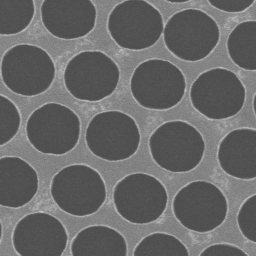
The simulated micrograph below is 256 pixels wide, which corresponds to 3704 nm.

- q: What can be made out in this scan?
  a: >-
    a regular array of holes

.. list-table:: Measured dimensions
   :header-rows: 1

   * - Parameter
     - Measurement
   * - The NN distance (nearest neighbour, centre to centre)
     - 0.881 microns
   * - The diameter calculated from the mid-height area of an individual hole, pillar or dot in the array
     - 52.3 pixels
